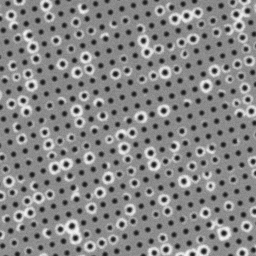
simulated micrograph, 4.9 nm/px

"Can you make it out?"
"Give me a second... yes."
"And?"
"a regular array of holes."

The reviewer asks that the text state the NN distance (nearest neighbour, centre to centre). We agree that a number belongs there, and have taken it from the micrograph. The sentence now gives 57.9 nanometers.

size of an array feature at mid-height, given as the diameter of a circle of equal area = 0.0271 µm